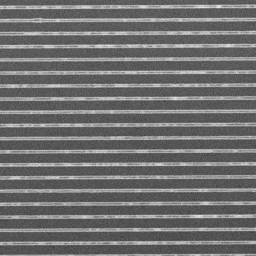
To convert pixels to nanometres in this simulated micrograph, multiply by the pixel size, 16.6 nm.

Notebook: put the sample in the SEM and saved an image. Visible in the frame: parallel lines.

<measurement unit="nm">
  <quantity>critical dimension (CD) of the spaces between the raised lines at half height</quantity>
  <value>176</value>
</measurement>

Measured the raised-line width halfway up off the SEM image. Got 0.0456 micrometres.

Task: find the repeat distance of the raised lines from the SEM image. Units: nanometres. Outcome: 218